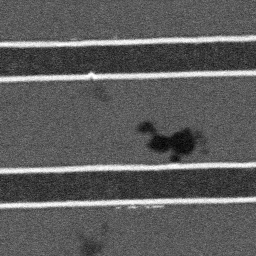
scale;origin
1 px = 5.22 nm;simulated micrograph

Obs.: one or a few lines or trenches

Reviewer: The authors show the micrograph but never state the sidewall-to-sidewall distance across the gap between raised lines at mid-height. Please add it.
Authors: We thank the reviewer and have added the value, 474 nm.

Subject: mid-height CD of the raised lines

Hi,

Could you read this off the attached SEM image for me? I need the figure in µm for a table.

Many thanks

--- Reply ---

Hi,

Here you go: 0.186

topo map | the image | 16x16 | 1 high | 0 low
0000000000000000
0000000000000000
0000000000010111
1111111111111111
1111111111111111
0000000000000000
0000000000000000
0000000000000000
0000000000000000
0000000000000000
0000000101111111
1111111111111111
1111111111111110
0000000000000000
0000000000000000
0000000000000000